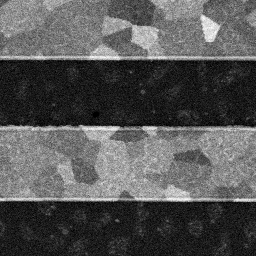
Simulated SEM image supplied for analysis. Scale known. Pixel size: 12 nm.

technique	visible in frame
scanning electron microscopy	one or a few lines or trenches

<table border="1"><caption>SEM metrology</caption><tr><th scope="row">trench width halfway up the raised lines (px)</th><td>70.6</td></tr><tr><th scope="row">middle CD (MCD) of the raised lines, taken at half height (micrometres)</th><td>0.845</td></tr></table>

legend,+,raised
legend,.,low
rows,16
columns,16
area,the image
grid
++++++++++++++++
++++++++++++++++
++++++++++++++++
++++++++++++++++
................
................
................
................
++++++++++++++++
++++++++++++++++
++++++++++++++++
++++++++++++++++
................
................
................
................